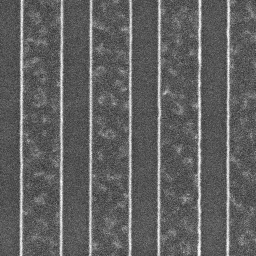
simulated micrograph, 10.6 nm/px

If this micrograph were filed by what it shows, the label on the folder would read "one or a few lines or trenches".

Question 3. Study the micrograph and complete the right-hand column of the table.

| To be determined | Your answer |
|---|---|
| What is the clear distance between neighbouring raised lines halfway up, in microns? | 0.308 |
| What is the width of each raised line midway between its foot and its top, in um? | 0.423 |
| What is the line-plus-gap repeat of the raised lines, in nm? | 732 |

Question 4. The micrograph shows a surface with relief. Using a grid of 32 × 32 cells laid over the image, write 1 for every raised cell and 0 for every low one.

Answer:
00011111000111110000111110000111
00011111000111110000111110000111
00011111000111110000111110000111
00011111000111110000111110000111
00011111000111110000111110000111
00011111000111110000111110000111
00011111000111110000111110000111
00011111000111110000111110000111
00011111000111110000111110000111
00011111000111110000111110000111
00011111000111110000111110000111
00011111000111110000111110000111
00011111000111110000111110001111
00011111000111110000111110001111
00011111000111110000111110000111
00011111000111110000111110001111
00011111000111110000111110000111
00011111000111110000111110001111
00011111000111110000111110001111
00011111000111110000111110001111
00011111000111110000111110000111
00011111000111110000111110000111
00011111000111110000111110000111
00011111000111110000111110000111
00011111000111110000111110000111
00011111000111110000111110000111
00011111000111110000111110000111
00011111000111110000111110000111
00011111000111110000111110000111
00011111000111110000111110000111
00011111000111110000111110000111
00011111000111110000111110001111